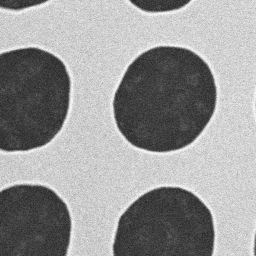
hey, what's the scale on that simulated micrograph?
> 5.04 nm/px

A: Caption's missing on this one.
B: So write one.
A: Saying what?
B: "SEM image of holes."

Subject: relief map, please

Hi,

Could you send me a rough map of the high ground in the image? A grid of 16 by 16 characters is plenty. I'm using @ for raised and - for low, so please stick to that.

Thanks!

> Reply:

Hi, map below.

--@@@@@@@--@@@@@
@@@@@@@@@@@@@@@@
@@@@@@@@@@@@@@@@
---@@@@@@---@@@@
----@@@@-----@@@
----@@@------@@@
----@@@------@@@
----@@@------@@@
---@@@@@----@@@@
@@@@@@@@@@@@@@@@
@@@@@@@@@@@@@@@@
@@@@@@@@@@@@@@@@
----@@@@@----@@@
----@@@@-----@@@
----@@@------@@@
----@@@------@@@